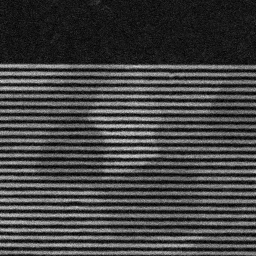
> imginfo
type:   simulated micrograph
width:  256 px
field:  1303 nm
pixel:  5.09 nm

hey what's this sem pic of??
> parallel lines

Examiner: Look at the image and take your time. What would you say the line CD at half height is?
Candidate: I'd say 3.5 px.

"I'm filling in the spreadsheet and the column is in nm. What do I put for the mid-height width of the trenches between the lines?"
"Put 22.3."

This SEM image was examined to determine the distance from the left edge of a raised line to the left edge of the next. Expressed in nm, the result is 37.9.